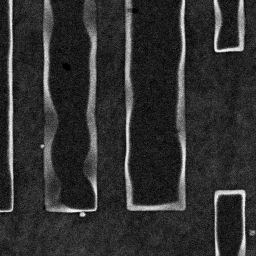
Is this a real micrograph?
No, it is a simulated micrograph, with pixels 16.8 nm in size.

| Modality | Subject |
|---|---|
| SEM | wiring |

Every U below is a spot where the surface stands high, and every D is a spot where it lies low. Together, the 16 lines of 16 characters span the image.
UDDUUUDDUUUDDUUD
UDDUUUDDUUUDDDUD
UDDUUUDDUUUDDUUD
UDDUUUDDUUUDDDDD
UDDUUUDDUUUDDDDD
UDDUUUDDUUUDDDDD
UDDUUUDDUUUDDDDD
UDDUUUDDUUUDDDDD
UDDUUUDDUUUDDDDD
UDDUUUDDUUUDDDDD
UDDUUUDDUUUDDDDD
UDDUUUDDUUUDDDDD
UDDUUUDDUUUDDUUD
DDDDDDDDDDDDDUUD
DDDDDDDDDDDDDUUD
DDDDDDDDDDDDDUUD